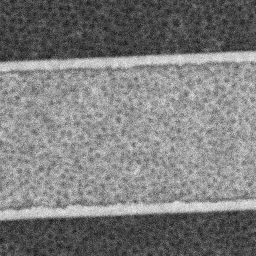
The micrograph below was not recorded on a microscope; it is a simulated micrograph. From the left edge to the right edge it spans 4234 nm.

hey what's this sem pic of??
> one or a few lines or trenches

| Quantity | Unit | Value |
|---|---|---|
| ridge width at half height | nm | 2450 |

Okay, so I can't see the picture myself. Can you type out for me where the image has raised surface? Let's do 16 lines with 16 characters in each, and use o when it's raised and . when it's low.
................
................
................
................
oooooooooooooooo
oooooooooooooooo
oooooooooooooooo
oooooooooooooooo
oooooooooooooooo
oooooooooooooooo
oooooooooooooooo
oooooooooooooooo
oooooooooooooooo
................
................
................